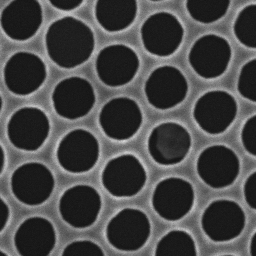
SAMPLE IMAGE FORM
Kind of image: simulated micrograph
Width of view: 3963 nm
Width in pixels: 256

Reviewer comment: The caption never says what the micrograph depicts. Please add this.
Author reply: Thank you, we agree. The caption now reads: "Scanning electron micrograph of a regular array of holes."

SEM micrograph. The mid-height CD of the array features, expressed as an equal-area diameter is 667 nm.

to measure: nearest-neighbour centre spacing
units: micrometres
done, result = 0.821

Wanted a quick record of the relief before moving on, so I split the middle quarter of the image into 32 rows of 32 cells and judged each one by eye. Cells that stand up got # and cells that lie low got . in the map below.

...#####...........######..#####
########..........#####......###
########..........####........##
#....####........####.........##
......###.......####...........#
.......#####..######...........#
.......#############...........#
........############...........#
........#####...#####.........##
........###.......###........###
.......###.........###......####
.......##..........#############
......###...........############
....#####...........############
#########...........######.#####
#########..........####.......##
##...#####.........###.........#
#......###........####.........#
........####.....####...........
.........############...........
.........############...........
.........############..........#
.........#############.........#
.........####.....####........##
........###........####......###
.......###..........############
......####..........############
#########............###########
#########............#####...###
##########..........####.......#
###....###..........###.........
#.......###........####.........